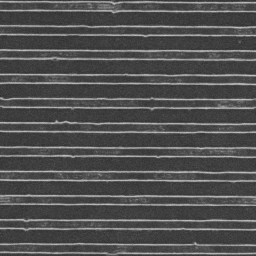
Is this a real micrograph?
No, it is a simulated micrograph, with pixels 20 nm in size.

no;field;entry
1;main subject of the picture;parallel lines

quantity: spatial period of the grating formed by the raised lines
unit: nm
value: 484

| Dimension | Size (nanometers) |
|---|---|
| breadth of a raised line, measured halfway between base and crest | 175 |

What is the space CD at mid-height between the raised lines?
314 nanometers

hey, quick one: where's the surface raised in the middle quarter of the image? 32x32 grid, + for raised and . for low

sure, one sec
................................
................................
................................
++++++++++++++++++++++++++++++++
++++++++++++++++++++++++++++++++
................................
................................
................................
................................
++++++++++++++++++++++++++++++++
++++++++++++++++++++++++++++++++
................................
................................
................................
................................
++++++++++++++++++++++++++++++++
++++++++++++++++++++++++++++++++
................................
................................
................................
................................
++++++++++++++++++++++++++++++++
++++++++++++++++++++++++++++++++
................................
................................
................................
................................
++++++++++++++++++++++++++++++++
++++++++++++++++++++++++++++++++
................................
................................
................................